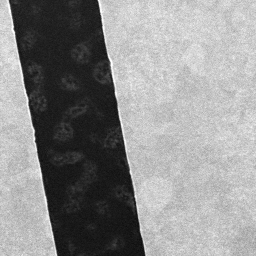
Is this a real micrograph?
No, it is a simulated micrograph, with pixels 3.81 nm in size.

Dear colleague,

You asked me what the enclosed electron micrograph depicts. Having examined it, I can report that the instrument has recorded one or a few lines or trenches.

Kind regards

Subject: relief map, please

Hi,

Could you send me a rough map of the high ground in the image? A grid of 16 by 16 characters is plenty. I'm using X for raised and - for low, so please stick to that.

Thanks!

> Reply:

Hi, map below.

X-----XXXXXXXXXX
X-----XXXXXXXXXX
X------XXXXXXXXX
X------XXXXXXXXX
X------XXXXXXXXX
XX-----XXXXXXXXX
XX-----XXXXXXXXX
XX------XXXXXXXX
XX------XXXXXXXX
XX------XXXXXXXX
XX------XXXXXXXX
XXX-----XXXXXXXX
XXX-----XXXXXXXX
XXX------XXXXXXX
XXX------XXXXXXX
XXX------XXXXXXX